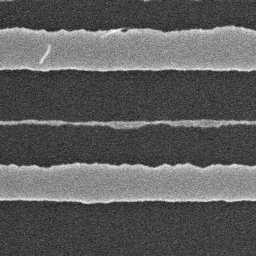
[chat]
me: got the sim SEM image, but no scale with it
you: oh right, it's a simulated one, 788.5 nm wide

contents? lines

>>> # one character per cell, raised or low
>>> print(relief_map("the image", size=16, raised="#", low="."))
................
................
################
################
................
................
................
................
................
................
################
################
..##############
................
................
................